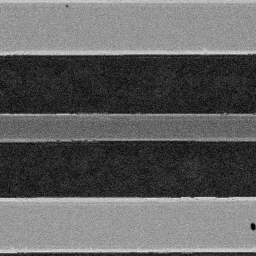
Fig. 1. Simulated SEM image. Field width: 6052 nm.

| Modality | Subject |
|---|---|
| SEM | lines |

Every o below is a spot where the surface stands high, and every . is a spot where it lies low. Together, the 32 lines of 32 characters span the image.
oooooooooooooooooooooooooooooooo
oooooooooooooooooooooooooooooooo
oooooooooooooooooooooooooooooooo
oooooooooooooooooooooooooooooooo
oooooooooooooooooooooooooooooooo
oooooooooooooooooooooooooooooooo
oooooooooooooooooooooooooooooooo
................................
................................
................................
................................
................................
................................
................................
oooooooooooooooooooooooooooooooo
oooooooooooooooooooooooooooooooo
oooooooooooooooooooooooooooooooo
................................
................................
................................
................................
................................
................................
................................
................................
oooooooooooooooooooooooooooooooo
oooooooooooooooooooooooooooooooo
oooooooooooooooooooooooooooooooo
oooooooooooooooooooooooooooooooo
oooooooooooooooooooooooooooooooo
oooooooooooooooooooooooooooooooo
................................